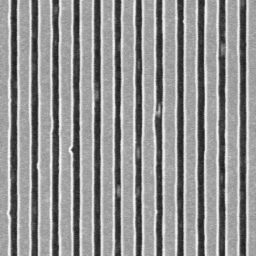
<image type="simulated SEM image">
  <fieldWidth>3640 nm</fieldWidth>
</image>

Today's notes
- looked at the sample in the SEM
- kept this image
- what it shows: parallel lines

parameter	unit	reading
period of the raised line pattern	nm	296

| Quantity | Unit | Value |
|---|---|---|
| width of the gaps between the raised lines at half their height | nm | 124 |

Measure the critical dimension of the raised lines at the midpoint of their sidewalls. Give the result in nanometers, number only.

180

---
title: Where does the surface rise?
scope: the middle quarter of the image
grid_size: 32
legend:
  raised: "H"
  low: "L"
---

HHLLHHHLLHHHLLLHHHLLHHHLLHHHLLHH
HHLLHHHLLHHHLLLHHLLLHHHLLHHHLLHH
HHLLHHHLLHHHLLLHHLLLHHHLLHHHLLHH
HHLLHHHLLHHHLLLHHLLLHHHLLHHHLLHH
HHLLHHHLLHHHLLLHHLLLHHHLLHHHLLHH
HHLLHHHLLLHHLLLHHLLLHHHLLHHHLLHH
HHLLHHHLLLHHLLLHHHLLHHHLLHHHLLHH
HHLLHHHLLLHHLLLHHLLLHHHLLHHHLLHH
HHLLHHHLLLHHLLLHHLLLHHHLLHHHLLHH
HHLLHHHLLLHHLLLHHLLLHHHLLHHHLLHH
HHLLHHHLLLHHHLLHHLLLHHHLLHHHLLHH
HHLLHHHLLLHHHLLHHLLLHHHLLHHHLLHH
HHLLHHHLLLHHLLLHHLLLHHHLLHHHLLHH
HHLLHHHLLLHHLLLHHLLLHHLLLHHHLLHH
HHLLHHHLLLHHLLHHHLLLHHLLLHHHLLHH
HHLLHHHLLLHHLLHHHLLLHHLLLHHHLLHH
HHLLHHHLLHHHLLHHHLLLHHHLLHHHLLHH
HHLLHHHLLHHHLLHHHLLLHHHLLHHHLLHH
HHLLHHHLLHHHLLHHHLLLHHHLLHHHLLHH
HHLLHHHLLHHHLLHHHLLLHHHLLHHHLLHH
HHLLHHHLLHHHLLHHHLLLHHHLLHHHLLHH
HHLLHHHLLHHHLLHHHLLLHHHLLHHHLLHH
HHLLHHHLLHHHLLHHHLLLHHHLLHHHLLHH
HHLLHHHLLHHHLLHHHLLLHHHLLHHHLLHH
HHLLHHHLLLHHLLHHHLLLHHHLLHHHLLHH
HHLLHHHLLHHHLLHHHLLLHHHLLHHHLLHH
HHLLHHHLLHHHLLHHHLLLHHHLLHHHLLHH
HHLLHHHLLHHHLLHHHLLLHHHLLHHHLLHH
HHLLHHHLLHHHLLHHHLLLHHHLLHHHLLHH
HHLLHHHLLHHHLLHHHLLLHHHLLHHHLLHH
HHLLHHHLLHHHLLHHHLLLHHHLLHHHLLHH
HHLLHHHLLHHHLLHHHLLLHHHLLHHHLLHH